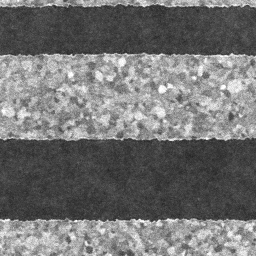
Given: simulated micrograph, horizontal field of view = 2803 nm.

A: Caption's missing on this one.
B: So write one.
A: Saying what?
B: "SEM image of one or a few lines or trenches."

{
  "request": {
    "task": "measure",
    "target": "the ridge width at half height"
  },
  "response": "921 nanometres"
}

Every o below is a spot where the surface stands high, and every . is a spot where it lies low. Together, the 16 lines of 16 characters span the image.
................
................
................
oooooooooooooooo
oooooooooooooooo
oooooooooooooooo
oooooooooooooooo
oooooooooooooooo
oooooooooooooooo
................
................
................
................
................
oooooooooooooooo
oooooooooooooooo